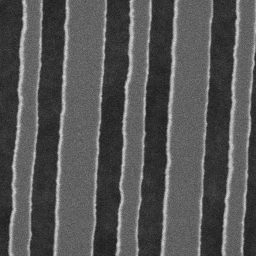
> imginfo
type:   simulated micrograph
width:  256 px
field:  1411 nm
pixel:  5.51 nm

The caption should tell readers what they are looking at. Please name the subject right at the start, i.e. lines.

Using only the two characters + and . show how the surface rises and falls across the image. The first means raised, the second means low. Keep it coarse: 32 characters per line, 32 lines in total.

...++...+++++...+++...+++++...++
...++...+++++...+++...+++++...++
...++...+++++...+++...++++...+++
...++...+++++...+++...++++...+++
...++...+++++...+++...++++...+++
...++...+++++...+++...++++...+++
..+++...+++++...+++...++++...+++
..+++...+++++...+++...++++...+++
..+++...+++++...+++..+++++...+++
..+++...+++++...+++..+++++...+++
..+++...+++++...++...+++++...+++
..+++...+++++...++...+++++...++.
..+++...+++++...++...+++++...++.
..+++...+++++...++...+++++...++.
..+++...+++++..+++...+++++...++.
..+++...+++++..+++...+++++...++.
..+++..+++++...+++...+++++...++.
..+++..+++++...+++...+++++...++.
..++...+++++...+++...+++++...++.
..++...+++++...+++...+++++...++.
..++...+++++...+++...++++....++.
..++...+++++...+++...++++....++.
..++...+++++...+++...++++...+++.
.+++...+++++...+++...++++...+++.
..++...+++++...+++...++++...+++.
..++...+++++...+++..+++++...+++.
.+++...+++++...++...+++++...+++.
.+++...+++++...++...+++++...+++.
.+++...+++++...++...+++++...++..
.+++...+++++...++...+++++...++..
.+++...+++++...++...+++++...++..
.+++...+++++..+++...+++++...++..